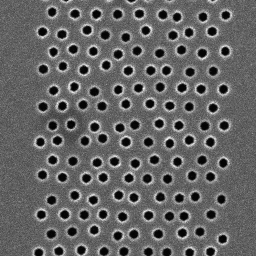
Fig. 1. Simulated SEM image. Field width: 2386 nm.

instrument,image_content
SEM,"a regular array of holes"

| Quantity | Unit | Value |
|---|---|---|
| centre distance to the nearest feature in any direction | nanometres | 167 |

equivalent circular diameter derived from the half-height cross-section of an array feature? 0.0874 micrometres